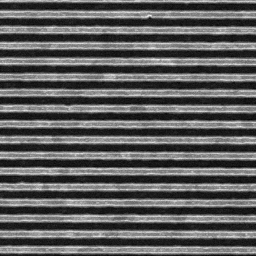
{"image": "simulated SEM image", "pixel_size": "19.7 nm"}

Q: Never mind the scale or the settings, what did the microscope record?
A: parallel lines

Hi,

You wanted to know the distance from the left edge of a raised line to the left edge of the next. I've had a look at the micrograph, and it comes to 310 nanometers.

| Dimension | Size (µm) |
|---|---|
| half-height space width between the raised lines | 0.168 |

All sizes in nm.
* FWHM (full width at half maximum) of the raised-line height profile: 133